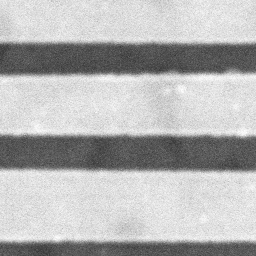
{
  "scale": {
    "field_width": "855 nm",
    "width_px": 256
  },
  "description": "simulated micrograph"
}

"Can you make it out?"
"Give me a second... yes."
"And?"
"lines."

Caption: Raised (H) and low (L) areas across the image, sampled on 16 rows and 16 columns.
HHHHHHHHHHHHHHHH
HHHHHHHHHHHHHHHH
HHHHHHHHHHHHHHHH
LLLLLLLLLLLLLLLL
LLLLLLLLLLLLLLLL
HHHHHHHHHHHHHHHH
HHHHHHHHHHHHHHHH
HHHHHHHHHHHHHHHH
LLLLLLLLLLLLLLLL
LLLLLLLLLLLLLLLL
LLLLLLLLLLLLLLLL
HHHHHHHHHHHHHHHH
HHHHHHHHHHHHHHHH
HHHHHHHHHHHHHHHH
HHHHHHHHHHHHHHHH
LLLLLLLLLLLLLLLL